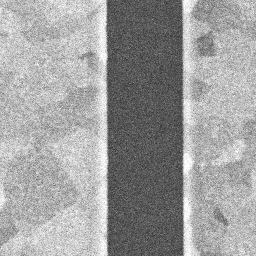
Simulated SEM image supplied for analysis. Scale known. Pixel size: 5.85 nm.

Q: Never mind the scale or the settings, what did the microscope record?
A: one or a few lines or trenches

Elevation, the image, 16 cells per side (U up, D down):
UUUUUUDDDDDDUUUU
UUUUUUDDDDDDUUUU
UUUUUUDDDDDDUUUU
UUUUUUDDDDDDUUUU
UUUUUUDDDDDDUUUU
UUUUUUDDDDDDUUUU
UUUUUUDDDDDDUUUU
UUUUUUDDDDDDUUUU
UUUUUUDDDDDDUUUU
UUUUUUDDDDDDUUUU
UUUUUUDDDDDDUUUU
UUUUUUUDDDDDUUUU
UUUUUUUDDDDDUUUU
UUUUUUUDDDDDUUUU
UUUUUUDDDDDDUUUU
UUUUUUUDDDDDUUUU